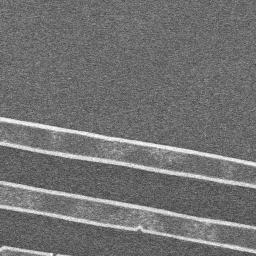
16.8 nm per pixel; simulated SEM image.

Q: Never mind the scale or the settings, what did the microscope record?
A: parallel lines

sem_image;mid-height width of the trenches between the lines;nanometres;645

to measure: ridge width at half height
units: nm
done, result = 409